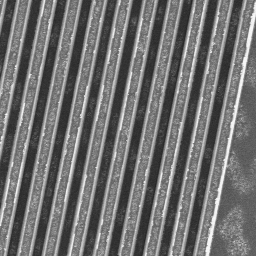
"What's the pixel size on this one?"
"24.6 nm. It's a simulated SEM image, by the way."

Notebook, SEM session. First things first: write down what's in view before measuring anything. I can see parallel lines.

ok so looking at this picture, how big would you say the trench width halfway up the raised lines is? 12 px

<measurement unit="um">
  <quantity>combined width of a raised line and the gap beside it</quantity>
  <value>0.608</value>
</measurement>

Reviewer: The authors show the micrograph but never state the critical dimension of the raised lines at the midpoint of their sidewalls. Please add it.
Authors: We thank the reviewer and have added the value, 320 nm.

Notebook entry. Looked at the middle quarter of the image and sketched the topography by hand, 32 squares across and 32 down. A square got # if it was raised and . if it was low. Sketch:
#...###...####...###...###...###
#...###...###...####...###...###
#...###...###...###....###...###
....###...###...###...####...###
...####...###...###...###....###
...###...####...###...###...####
...###...###....###...###...###.
...###...###...####...###...###.
...###...###...###...####...###.
..####...###...###...####...###.
..###...####...###...###...####.
..###...###....###...###...###..
..###...###...####...###...###..
..###...###...###....###...###..
.####...###...###...####...###..
.###...####...###...###...####..
.###...###....###...###...####..
.###...###...####...###...###...
.###...###...###....###...###...
####...###...###...####...###...
###...####...###...###....###...
###...###....###...###...####..#
###...###...####...###...###...#
###...###...###....###...###...#
###...###...###...####...###...#
##...####...###...###....###...#
##...###....###...###...####..##
##...###...####...###...###...##
##...###...###....###...###...##
##...###...###...####...###...##
#...####...###...###....###...##
#...###....###...###...####..###